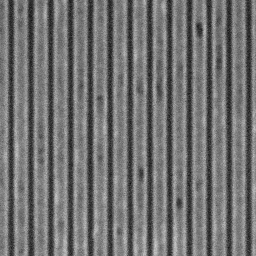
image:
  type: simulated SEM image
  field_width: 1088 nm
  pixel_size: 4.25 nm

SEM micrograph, parallel lines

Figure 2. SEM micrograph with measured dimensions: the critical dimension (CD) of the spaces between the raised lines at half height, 30.8 nanometres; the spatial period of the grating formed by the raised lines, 84.1 nm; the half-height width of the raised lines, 55.2 nm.